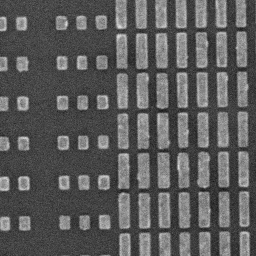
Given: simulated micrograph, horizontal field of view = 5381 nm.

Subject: wiring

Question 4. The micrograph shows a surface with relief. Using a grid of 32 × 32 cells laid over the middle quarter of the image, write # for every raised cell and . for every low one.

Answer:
...###..###...##..###..###...##.
................................
...................##...#....#..
..............##..###..###...##.
..............##..###..###...#..
..............##..###..###...#..
..............##...##..###...##.
..............##...##..###...##.
#..###..###...##...##..###...##.
#..###..###...##...##...##...##.
#...##..###...#....##...##...#..
................................
........................##...#..
..............##...##...##...##.
..............##...##...##...##.
..............##...##...##...##.
..............##...##...##...##.
..............##...##...##...##.
#...##...##...##...##...##...##.
#...##...##...##...##...##...##.
#...##...##...##...##...##...##.
................................
...................##...##...##.
..............##...##...##...##.
..............##...##...##...##.
..............##...##...##...##.
..............##...##...##...##.
..............##...##...##...##.
#...##...##...##...##...##...##.
#...##...##...##...##...##...##.
#...##...##...##...##...##...##.
................................